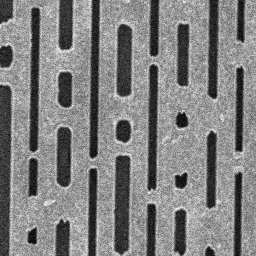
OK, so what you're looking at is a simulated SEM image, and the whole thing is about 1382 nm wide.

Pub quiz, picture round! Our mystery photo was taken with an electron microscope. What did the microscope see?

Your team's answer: parallel lines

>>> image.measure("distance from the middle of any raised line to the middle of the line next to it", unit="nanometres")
160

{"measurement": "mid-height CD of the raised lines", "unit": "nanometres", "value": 95.2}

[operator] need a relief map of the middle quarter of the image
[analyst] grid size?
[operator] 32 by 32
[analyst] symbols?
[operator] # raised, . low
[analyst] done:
######...####....####..#####...#
######...####....####...####...#
..####...####....####...####...#
..####...####....####...####...#
..####...####....####...####...#
..####...####....####...#####..#
..####...####....####...########
..#####..####....####...########
..#####..############...########
..####...############...########
..####...############..#########
######...############..#########
######...############..#####..##
######...############..#####...#
######...####...#####..#####...#
######...####....####..#####...#
..####...####....####..#########
..####...####....####..#########
..####...####....####..#########
..####...#####..#####..#########
..####...############..#########
..####...############..#########
..####...############..#########
..#####.#####....####..#########
..###########....####..#########
..###########....####..#########
..####..#####....####..#########
..####..#####....####..#######.#
..####..#####....####..#####...#
..####..#####....####..#####...#
.#####..#####....####..#####..##
######..#####....####.##########